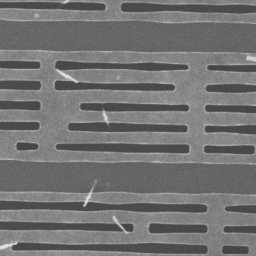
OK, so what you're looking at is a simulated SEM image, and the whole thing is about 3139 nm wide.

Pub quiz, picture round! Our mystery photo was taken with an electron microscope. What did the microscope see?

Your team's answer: groups of lines, slits or small figures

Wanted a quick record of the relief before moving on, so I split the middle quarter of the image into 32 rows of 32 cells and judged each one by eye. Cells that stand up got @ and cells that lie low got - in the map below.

-------------------------------@
----@@@@@@@@@@@@---------------@
@@@@@@@@@@@@@@@@@@@@@@@@@@@@@@@@
@@@@@@@@@@@@@@@@@@@@@@@@@@@@@@@@
---@@@@@@@@@@@@@@@@@@@@@@@@@@@@@
----------------------------@@@@
-----@@@@@@----------------@@@@@
@@@@@@@@@@@@@@@@@@@@@@@@@@@@@@@@
@@@@@@@@@@@@@@@@@@@@@@@@@@@@@@@@
@@@@@@@@@@@-@@@@@@@@@@@@@@@@@@@@
@@@@---------------------------@
@@@@---------------------------@
@@@@@@@@@@@@@@@@@@@@@@@@@@@@@@@@
@@@@@@@@@@@@@@@@@@@@@@@@@@@@@@@@
@@@@@@@@--@@@@@@@@@@@@@@@@@@@@@@
@------------------------------@
@------------------------------@
@@@@@@@@@@@@@@@@@@@@@@@@@@@@@@@@
@@@@@@@@@@@@@@@@@@@@@@@@@@@@@@@@
@@@@@@@@@@@@@@@@@@@@@@@@@@@@@@@@
-------------------------------@
-------------------------------@
@@@@@@@@@@@@@@@@@@@@@@@@@@@----@
@@@@@@@@@@@@@@@@@@@@@@@@@@@@@@@@
--------@@@@@@-------@@@@@@@@@@@
--------------------------------
--------------------------------
--------------------------------
--------------------------------
--------------------------------
--------------------------------
--------------------------------